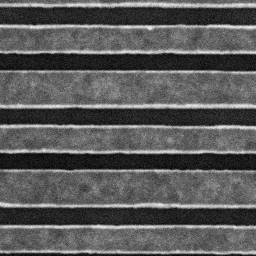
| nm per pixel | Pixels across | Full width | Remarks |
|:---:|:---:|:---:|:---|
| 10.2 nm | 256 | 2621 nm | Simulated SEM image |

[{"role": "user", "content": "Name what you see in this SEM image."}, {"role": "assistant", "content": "lines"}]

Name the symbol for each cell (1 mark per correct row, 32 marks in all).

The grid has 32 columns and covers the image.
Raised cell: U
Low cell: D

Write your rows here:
UUUUUUUUUUUUUUUUUUUUUUUUUUUUUUUU
DDDDDDDDDDDDDDDDDDDDDDDDDDDDDDDD
DDDDDDDDDDDDDDDDDDDDDDDDDDDDDDDD
UUUUUUUUUUUUUUUUUUUUUUUUUUUUUUUU
UUUUUUUUUUUUUUUUUUUUUUUUUUUUUUUU
UUUUUUUUUUUUUUUUUUUUUUUUUUUUUUUU
UUUUUUUUUUUUUUUUUUUUUUUUUUUUUUUU
DDDDDDDDDDDDDDDDDDDDDDDDDDDDDDDD
DDDDDDDDDDDDDDDDDDDDDDDDDDDDDDDD
UUUUUUUUUUUUUUUUUUUUUUUUUUUUUUUU
UUUUUUUUUUUUUUUUUUUUUUUUUUUUUUUU
UUUUUUUUUUUUUUUUUUUUUUUUUUUUUUUU
UUUUUUUUUUUUUUUUUUUUUUUUUUUUUUUU
DDDDDDDDDDDDDDDDDDDDDDDDDDDDDDDD
DDDDDDDDDDDDDDDDDDDDDDDDDDDDDDDD
DDDDDDDDDDDDDDDDDDDDDDDDDDDDDDDD
UUUUUUUUUUUUUUUUUUUUUUUUUUUUUUUU
UUUUUUUUUUUUUUUUUUUUUUUUUUUUUUUU
UUUUUUUUUUUUUUUUUUUUUUUUUUUUUUUU
DDDDDDDDDDDDDDDDDDDDDDDDDDDDDDDD
DDDDDDDDDDDDDDDDDDDDDDDDDDDDDDDD
UUUUUUUUUUUUUUUUUUUUUUUUUUUUUUUU
UUUUUUUUUUUUUUUUUUUUUUUUUUUUUUUU
UUUUUUUUUUUUUUUUUUUUUUUUUUUUUUUU
UUUUUUUUUUUUUUUUUUUUUUUUUUUUUUUU
UUUUUUUUUUUUUUUUUUUUUUUUUUUUUUUU
DDDDDDDDDDDDDDDDDDDDDDDDDDDDDDDD
DDDDDDDDDDDDDDDDDDDDDDDDDDDDDDDD
UUUUUUUUUUUUUUUUUUUUUUUUUUUUUUUU
UUUUUUUUUUUUUUUUUUUUUUUUUUUUUUUU
UUUUUUUUUUUUUUUUUUUUUUUUUUUUUUUU
UUUUUUUUUUUUUUUUUUUUUUUUUUUUUUUU